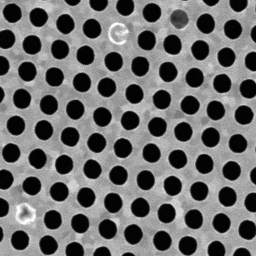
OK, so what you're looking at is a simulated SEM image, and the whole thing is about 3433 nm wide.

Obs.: a regular array of holes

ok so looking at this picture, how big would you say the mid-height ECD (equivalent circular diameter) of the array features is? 255 nanometers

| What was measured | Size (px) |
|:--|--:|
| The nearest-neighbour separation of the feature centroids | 26.9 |